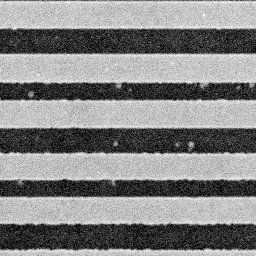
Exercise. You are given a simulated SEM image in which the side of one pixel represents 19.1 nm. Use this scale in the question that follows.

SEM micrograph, lines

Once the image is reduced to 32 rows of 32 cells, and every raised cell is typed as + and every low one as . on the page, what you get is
++++++++++++++++++++++++++++++++
++++++++++++++++++++++++++++++++
++++++++++++++++++++++++++++++++
.+.........................+....
................................
................................
................................
++++++++++++++++++++++++++++++++
++++++++++++++++++++++++++++++++
++++++++++++++++++++++++++++++++
................................
................................
................................
++++++++++++++++++++++++++++++++
++++++++++++++++++++++++++++++++
++++++++++++++++++++++++++++++++
................................
................................
................................
++++++++++++++++++++++++++++++++
++++++++++++++++++++++++++++++++
++++++++++++++++++++++++++++++++
................................
................................
................................
++++++++++++++++++++++++++++++++
++++++++++++++++++++++++++++++++
++++++++++++++++++++++++++++++++
................................
................................
................................
++++++++++++++++++++++++++++++++